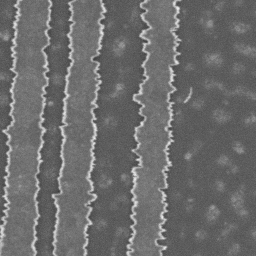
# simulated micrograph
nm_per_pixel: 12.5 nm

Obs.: one or a few lines or trenches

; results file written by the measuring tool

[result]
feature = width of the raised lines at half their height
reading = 389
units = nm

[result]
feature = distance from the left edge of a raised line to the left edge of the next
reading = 816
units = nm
